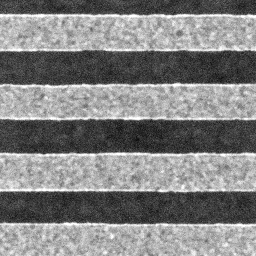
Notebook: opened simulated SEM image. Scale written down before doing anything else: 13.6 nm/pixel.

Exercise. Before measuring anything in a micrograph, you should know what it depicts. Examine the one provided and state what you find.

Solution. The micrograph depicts lines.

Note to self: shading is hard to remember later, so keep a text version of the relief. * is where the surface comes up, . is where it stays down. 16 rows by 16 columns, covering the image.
................
****************
****************
................
................
****************
****************
................
................
................
****************
****************
................
................
****************
****************